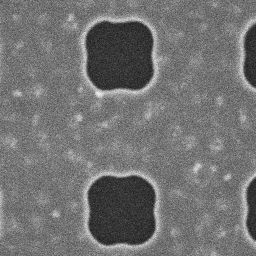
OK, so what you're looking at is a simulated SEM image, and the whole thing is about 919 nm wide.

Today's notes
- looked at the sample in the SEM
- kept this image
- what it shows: holes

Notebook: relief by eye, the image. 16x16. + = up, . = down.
++++++++++++++++
++++++...+++++++
+++++.....+++++.
+++++.....+++++.
+++++.....+++++.
++++++...+++++++
++++++++++++++++
++++++++++++++++
++++++++++++++++
++++++++++++++++
++++++++++++++++
++++++...+++++++
++++++....+++++.
++++++....+++++.
++++++....++++++
++++++++++++++++